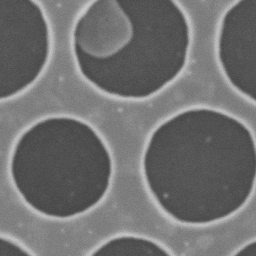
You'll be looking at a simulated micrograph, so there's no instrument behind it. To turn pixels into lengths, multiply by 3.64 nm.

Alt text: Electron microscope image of holes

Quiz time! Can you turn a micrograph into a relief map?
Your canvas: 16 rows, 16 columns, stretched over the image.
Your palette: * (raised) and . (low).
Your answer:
..****.....***..
...**.......**..
...**.......**..
...**.......**..
...**......***..
..****....*****.
****************
***..******....*
*.....****......
*......**.......
*......**.......
*......**.......
**....****.....*
***.*******...**
****************
.*****....*****.